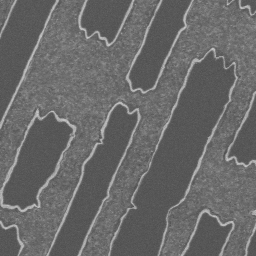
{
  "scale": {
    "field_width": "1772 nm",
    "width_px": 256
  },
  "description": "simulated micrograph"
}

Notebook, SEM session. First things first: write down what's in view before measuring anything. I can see one or a few lines or trenches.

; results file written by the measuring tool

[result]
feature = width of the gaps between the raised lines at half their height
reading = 178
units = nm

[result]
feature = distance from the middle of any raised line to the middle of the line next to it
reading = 0.43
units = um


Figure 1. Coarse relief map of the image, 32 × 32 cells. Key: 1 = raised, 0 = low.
00111110000111111000111100000011
01111100001111110001111000000001
01111100001111110001111000000000
11111100001111100011111000000000
11111000000011100011110000000000
11111000000000000011110000000000
11110000000000000111100000100000
11110000000000000111100001110000
11100000000000001111000011111000
11100000000000001111000111111100
11100000000000001111000111111000
11000000000000000000001111111000
11000000000000000000001111111000
10000000000000110000001111110001
10001010000000111000011111110001
00001111100001111000011111100011
00011111100001111000111111100011
00011111100001110000111111000111
00111111000011110000111111000111
00111111000111110001111110001111
00111110001111100001111110000010
01111110001111100011111100000000
01111100001111000111111100000000
11111000001111000111111100000000
11111000011110000111111000000000
11111000011110000111110000000000
00000000111100001111100001000000
00000000111100011111100001100000
11000001111000011111100011111000
11000001111000111111100011111001
11100001111000111111000011110001
11100011110000111111000111110001